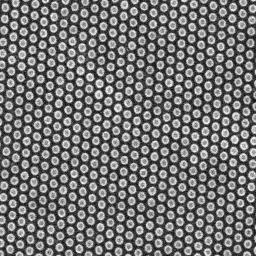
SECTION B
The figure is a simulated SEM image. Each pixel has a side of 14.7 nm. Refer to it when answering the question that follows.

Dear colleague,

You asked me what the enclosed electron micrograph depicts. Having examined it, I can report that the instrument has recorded a regular array of raised bodies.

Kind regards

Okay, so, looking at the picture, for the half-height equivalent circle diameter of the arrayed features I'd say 113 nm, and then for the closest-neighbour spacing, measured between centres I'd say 165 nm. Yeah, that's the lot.